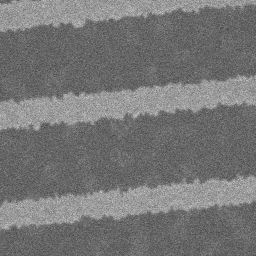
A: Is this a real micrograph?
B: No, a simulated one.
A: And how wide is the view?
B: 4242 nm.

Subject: one or a few lines or trenches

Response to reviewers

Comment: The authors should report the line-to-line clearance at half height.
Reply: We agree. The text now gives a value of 1220 nanometres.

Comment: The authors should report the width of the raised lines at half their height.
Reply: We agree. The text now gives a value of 410 nanometers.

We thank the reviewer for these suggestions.